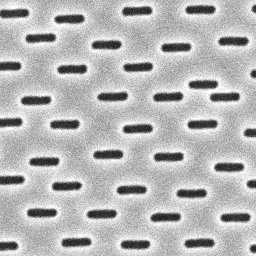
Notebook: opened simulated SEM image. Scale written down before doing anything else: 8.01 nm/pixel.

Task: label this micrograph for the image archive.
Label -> a regular array of holes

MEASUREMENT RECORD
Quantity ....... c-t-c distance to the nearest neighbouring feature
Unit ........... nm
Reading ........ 308